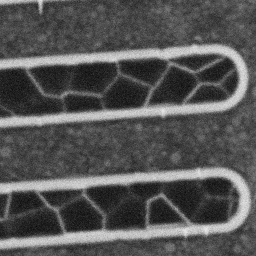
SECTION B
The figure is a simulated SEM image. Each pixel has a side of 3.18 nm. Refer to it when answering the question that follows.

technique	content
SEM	one or a few lines or trenches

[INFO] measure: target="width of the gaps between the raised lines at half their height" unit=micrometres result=0.203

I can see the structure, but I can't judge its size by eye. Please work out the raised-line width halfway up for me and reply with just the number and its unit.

0.184 micrometres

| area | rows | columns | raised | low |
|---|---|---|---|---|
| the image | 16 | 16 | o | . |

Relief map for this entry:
................
................
................
.......oooooooo.
ooooooooooooooo.
ooooooooooooooo.
oooooooooooooo..
ooo.............
................
................
................
...oooooooooooo.
ooooooooooooooo.
ooooooooooooooo.
ooooooooooo.....
................